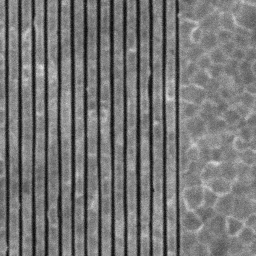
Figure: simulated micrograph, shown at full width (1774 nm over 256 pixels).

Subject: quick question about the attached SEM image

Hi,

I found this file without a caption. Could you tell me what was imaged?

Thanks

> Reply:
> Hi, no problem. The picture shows parallel lines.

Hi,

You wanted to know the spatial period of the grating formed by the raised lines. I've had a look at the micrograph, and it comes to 13.1 px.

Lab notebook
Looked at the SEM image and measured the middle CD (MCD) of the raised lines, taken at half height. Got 0.0607 um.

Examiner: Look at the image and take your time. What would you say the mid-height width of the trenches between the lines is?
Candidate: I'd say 26.9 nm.